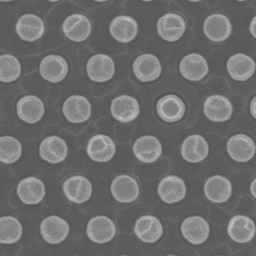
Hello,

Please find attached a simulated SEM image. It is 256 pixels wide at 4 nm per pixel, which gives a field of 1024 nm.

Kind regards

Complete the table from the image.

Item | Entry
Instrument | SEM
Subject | a regular array of raised bodies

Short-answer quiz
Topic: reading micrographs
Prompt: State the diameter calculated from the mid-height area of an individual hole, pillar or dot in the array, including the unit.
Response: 111 nm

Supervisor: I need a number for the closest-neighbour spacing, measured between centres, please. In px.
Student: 46.2